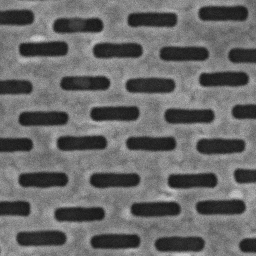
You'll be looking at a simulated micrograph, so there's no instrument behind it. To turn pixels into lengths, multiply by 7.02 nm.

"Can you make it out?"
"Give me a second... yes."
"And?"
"a regular array of holes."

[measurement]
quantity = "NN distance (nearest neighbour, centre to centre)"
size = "315 nanometers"